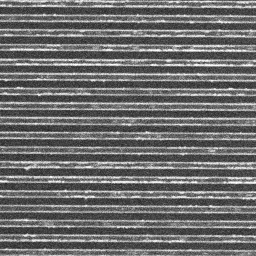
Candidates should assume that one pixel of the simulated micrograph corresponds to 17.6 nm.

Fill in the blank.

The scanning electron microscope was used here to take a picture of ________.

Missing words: parallel lines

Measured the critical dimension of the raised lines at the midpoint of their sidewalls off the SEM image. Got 121 nanometres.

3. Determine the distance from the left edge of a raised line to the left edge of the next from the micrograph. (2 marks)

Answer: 258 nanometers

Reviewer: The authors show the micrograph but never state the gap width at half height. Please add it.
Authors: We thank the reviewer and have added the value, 0.139 microns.